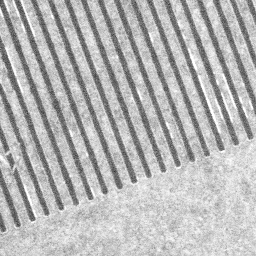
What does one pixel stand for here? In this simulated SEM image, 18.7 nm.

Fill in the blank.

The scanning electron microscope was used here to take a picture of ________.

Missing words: parallel lines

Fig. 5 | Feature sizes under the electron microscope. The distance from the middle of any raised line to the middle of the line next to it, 289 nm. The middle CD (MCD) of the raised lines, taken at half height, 0.138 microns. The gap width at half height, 153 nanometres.